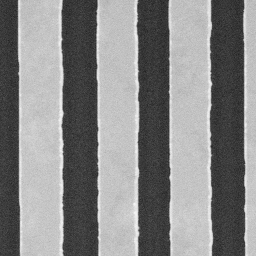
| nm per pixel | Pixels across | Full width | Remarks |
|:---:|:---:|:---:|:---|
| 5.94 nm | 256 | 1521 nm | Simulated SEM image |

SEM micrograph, lines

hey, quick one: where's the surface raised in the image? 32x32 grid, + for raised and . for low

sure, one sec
..++++++....+++++....+++++.....+
..++++++....+++++....+++++.....+
..++++++....+++++....+++++.....+
..++++++....+++++....+++++.....+
..++++++....+++++....+++++.....+
..++++++....+++++....+++++.....+
..++++++....+++++....+++++.....+
..++++++....+++++....+++++.....+
..++++++....+++++....+++++.....+
..++++++....+++++....+++++.....+
..++++++....+++++....+++++.....+
..++++++....+++++....+++++.....+
..++++++....+++++....+++++.....+
..++++++....+++++....+++++.....+
..++++++....+++++....+++++.....+
..++++++....+++++....+++++.....+
..++++++....+++++....+++++.....+
..++++++....+++++....+++++.....+
..++++++....+++++....+++++.....+
..++++++....+++++....+++++.....+
..++++++....+++++....+++++.....+
..++++++....+++++....+++++.....+
..++++++....+++++....+++++.....+
..++++++....+++++....+++++.....+
..++++++....+++++....+++++.....+
..++++++....+++++....+++++.....+
...+++++....+++++....+++++.....+
...+++++....+++++....+++++.....+
...+++++....+++++....+++++.....+
...+++++....+++++....++++++....+
...+++++....+++++....++++++....+
...+++++....+++++....+++++.....+